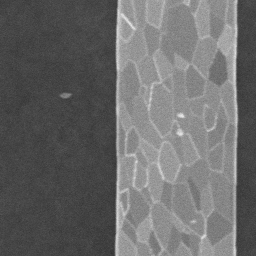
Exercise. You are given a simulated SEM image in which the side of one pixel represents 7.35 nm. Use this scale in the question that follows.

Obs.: wiring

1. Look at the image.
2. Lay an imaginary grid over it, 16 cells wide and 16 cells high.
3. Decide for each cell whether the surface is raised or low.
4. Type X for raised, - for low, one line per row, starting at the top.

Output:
-------XXXXXXXX-
-------XXXXXXXX-
-------XXXXXXXX-
-------XXXXXXXX-
-------XXXXXXXX-
-------XXXXXXXX-
-------XXXXXXXX-
-------XXXXXXXX-
-------XXXXXXXX-
-------XXXXXXXX-
-------XXXXXXXX-
-------XXXXXXXX-
-------XXXXXXXX-
-------XXXXXXXX-
-------XXXXXXXX-
-------XXXXXXXX-